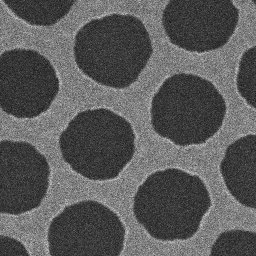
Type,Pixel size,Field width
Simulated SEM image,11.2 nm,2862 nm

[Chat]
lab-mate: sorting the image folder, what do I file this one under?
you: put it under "holes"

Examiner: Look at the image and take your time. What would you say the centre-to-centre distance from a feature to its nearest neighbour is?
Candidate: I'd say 95.1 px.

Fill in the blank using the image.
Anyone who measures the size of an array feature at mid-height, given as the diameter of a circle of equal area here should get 74.2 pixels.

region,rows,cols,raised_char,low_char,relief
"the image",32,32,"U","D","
UDDDDDDDDUUUUUUUUUUUUDDDDDDDDUUU
UUDDDDDDDUUUUUUUUUUUDDDDDDDDDDUU
UUUDDDDUUUUDDDDDDUUUDDDDDDDDDDUU
UUUUUUUUUUDDDDDDDDUUDDDDDDDDDDUU
UUUUUUUUUDDDDDDDDDDUUDDDDDDDDUUU
UUUUUUUUUDDDDDDDDDDUUUDDDDDDUUUU
UDDDDUUUUDDDDDDDDDDUUUUUDDUUUUUD
DDDDDDUUUDDDDDDDDDDUUUUUUUUUUUDD
DDDDDDDUUUDDDDDDDDUUUUUUUUUUUUDD
DDDDDDDUUUUDDDDDDUUUUDDDDUUUUUDD
DDDDDDDUUUUUDDDDUUUUDDDDDDDUUUDD
DDDDDDDUUUUUUUUUUUUDDDDDDDDUUUDD
DDDDDDDUUUUUUUUUUUUDDDDDDDDDUUUD
DDDDDDUUUUUUDUUUUUUDDDDDDDDDUUUU
UUDDDUUUUDDDDDDUUUUDDDDDDDDDUUUU
UUUUUUUUUDDDDDDDUUUDDDDDDDDDUUUU
UUUUUUUUDDDDDDDDDUUDDDDDDDDUUUUU
UUUUUUUDDDDDDDDDDUUUUDDDDDUUUDDD
DDDDUUUDDDDDDDDDDUUUUUUUUUUUDDDD
DDDDDDUUDDDDDDDDDUUUUUUUUUUUDDDD
DDDDDDUUDDDDDDDDUUUUUUUUUUUUDDDD
DDDDDDUUUDDDDDDUUUUDDDDUUUUUDDDD
DDDDDDUUUUUDDUUUUUDDDDDDDUUUDDDD
DDDDDDUUUUUUUUUUUDDDDDDDDDUUDDDD
DDDDDDUUUUUUUUUUUDDDDDDDDDUUUDDD
DDDDDUUUUDDDDUUUUDDDDDDDDDUUUUDD
DDDUUUUUDDDDDDUUUDDDDDDDDDUUUUUU
UUUUUUDDDDDDDDDUUDDDDDDDDUUUUUUU
UUUUUUDDDDDDDDDDUUDDDDDDDUUUUUUU
DUUUUUDDDDDDDDDDUUUDDDDDUUUDDDDD
DDDUUUDDDDDDDDDUUUUUUUUUUUUDDDDD
DDDDUUDDDDDDDDDUUUUUUUUUUUDDDDDD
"